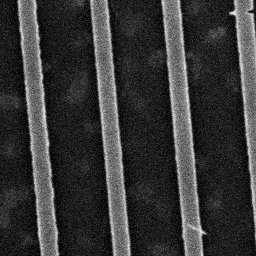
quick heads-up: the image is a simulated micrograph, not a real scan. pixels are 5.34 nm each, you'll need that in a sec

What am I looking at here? one or a few lines or trenches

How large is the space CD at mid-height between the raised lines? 294 nm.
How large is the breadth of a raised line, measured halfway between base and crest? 89.1 nanometers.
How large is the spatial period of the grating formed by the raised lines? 71.8 pixels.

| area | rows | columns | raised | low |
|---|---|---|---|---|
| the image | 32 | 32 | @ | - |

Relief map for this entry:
--@@-------@@-------@@-------@@@
--@@-------@@@------@@@------@@-
--@@@-------@@-------@@-------@@
---@@-------@@-------@@-------@@
---@@-------@@-------@@-------@@
---@@-------@@-------@@-------@@
---@@-------@@-------@@-------@@
---@@-------@@-------@@-------@@
---@@-------@@-------@@-------@@
---@@-------@@-------@@-------@@
---@@-------@@-------@@-------@@
---@@-------@@-------@@-------@@
---@@-------@@-------@@@-------@
---@@@-------@@------@@@-------@
----@@-------@@-------@@-------@
----@@-------@@-------@@-------@
----@@-------@@-------@@-------@
----@@-------@@-------@@-------@
----@@-------@@-------@@-------@
----@@-------@@-------@@-------@
----@@-------@@-------@@-------@
----@@-------@@-------@@-------@
----@@-------@@-------@@-------@
----@@@------@@@------@@@------@
-----@@-------@@-------@@-------
-----@@-------@@-------@@-------
-----@@-------@@-------@@-------
-----@@-------@@-------@@-------
-----@@-------@@-------@@-------
-----@@-------@@-------@@-------
-----@@-------@@-------@@-------
-----@@-------@@-------@@-------